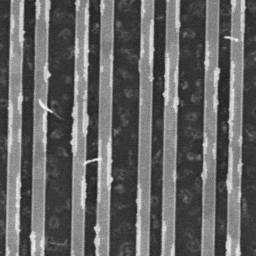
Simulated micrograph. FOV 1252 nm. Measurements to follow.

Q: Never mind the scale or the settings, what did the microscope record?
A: parallel lines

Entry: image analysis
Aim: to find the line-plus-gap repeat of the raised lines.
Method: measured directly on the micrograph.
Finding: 0.154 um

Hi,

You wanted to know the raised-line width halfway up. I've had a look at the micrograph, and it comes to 59.9 nm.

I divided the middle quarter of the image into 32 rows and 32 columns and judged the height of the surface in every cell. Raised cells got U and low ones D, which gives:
DDDUUUDDDUUUDDDDDDDUUUDDDUUUDDDD
DDDUUUDDDUUUDDDDDDDUUUDDDUUUDDDD
DDDUUUDDDUUUDDDDDDDUUUDDDUUUDDDD
DDDUUUDDDUUUDDDDDDDUUUDDDUUUDDDD
DDDUUUDDDUUUDDDDDDDUUUDDDUUUDDDD
DDDUUDDDDUUUDDDDDDDUUUDDDUUUDDDD
DDDUUDDDDUUUDDDDDDDUUUDDDUUUDDDD
DDDUUUDDDUUUDDDDDDDUUUDDDUUUDDDD
DDDUUUDDDUUUDDDDDDDUUUDDDUUUUDDD
DDDUUUDDDUUUDDDDDDDUUUDDDUUUUDDD
DDUUUUDDDUUUDDDDDDDUUUDDDUUUDDDD
DDUUUUDDDUUUDDDDDDDUUUDDDUUUDDDD
DDUUUUDDDUUUDDDDDDDUUUDDDUUUDDDD
DDUUUUDDDUUUDDDDDDDUUUDDDUUUDDDD
DDUUUUDDDUUUDDDDDDDUUUDDDUUUDDDD
DDUUUUDDDUUUDDDDDDDUUUDDDUUUDDDD
DDUUUUDDDUUUDDDDDDDUUUDDDUUUDDDD
DDUUUUDDDUUUDDDDDDDUUUDDDUUUDDDD
DDUUUDDDDUUUDDDDDDDUUUDDDUUUDDDD
DDUUUDDDDUUUDDDDDDDUUUDDDUUUDDDD
DDUUUDDDDUUUDDDDDDDUUDDDDUUUDDDD
DDUUUDDDDUUUDDDDDDDUUDDDDUUUDDDD
DDUUUDDDDUUUDDDDDDDUUDDDDUUUDDDD
DDDUUDDDUUUUDDDDDDDUUDDDDUUUDDDD
DDDUUUDDDUUUDDDDDDDUUDDDDUUUDDDD
DDUUUDDDDUUUDDDDDDDUUDDDDUUUDDDD
DDUUUDDDDUUUDDDDDDDUUDDDDUUUDDDD
DDUUUDDDDUUUDDDDDDDUUDDDDUUUDDDD
DDUUUDDDDUUUDDDDDDDUUDDDDUUUDDDD
DDUUUDDDDUUUDDDDDDDUUDDDDUUUDDDD
DDUUUDDDDUUUDDDDDDUUUDDDDUUUDDDD
DDUUUDDDDUUUDDDDDDUUUDDDDUUUDDDD